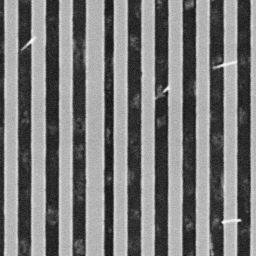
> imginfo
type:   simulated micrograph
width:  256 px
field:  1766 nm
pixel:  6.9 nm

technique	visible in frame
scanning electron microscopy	parallel lines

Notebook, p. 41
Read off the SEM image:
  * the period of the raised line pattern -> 189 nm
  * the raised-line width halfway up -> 89.7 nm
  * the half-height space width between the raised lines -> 95.7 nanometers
